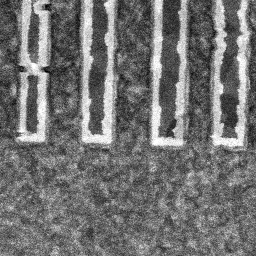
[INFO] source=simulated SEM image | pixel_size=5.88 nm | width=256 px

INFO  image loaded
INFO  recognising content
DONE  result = one or a few lines or trenches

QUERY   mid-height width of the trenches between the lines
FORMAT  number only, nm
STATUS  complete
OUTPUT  250